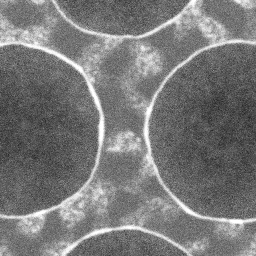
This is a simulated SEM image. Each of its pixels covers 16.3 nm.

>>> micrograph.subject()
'holes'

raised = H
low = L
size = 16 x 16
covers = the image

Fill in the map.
HHHHLLLLLLLLHHHH
HHHHHLLLLLHHHHHH
HHHHHHHHHHHHHHHH
LLLLHHHHHHHHLLLL
LLLLLHHHHHHLLLLL
LLLLLLHHHHLLLLLL
LLLLLLHHHHLLLLLL
LLLLLLHHHLLLLLLL
LLLLLLHHHLLLLLLL
LLLLLLHHHLLLLLLL
LLLLLLHHHHLLLLLL
LLLLLHHHHHLLLLLL
LLLLHHHHHHHLLLLL
LHHHHHHHHHHHHLLL
HHHHHHLLLHHHHHHH
HHHHHLLLLLLHHHHH